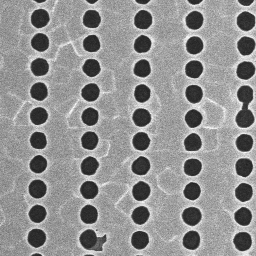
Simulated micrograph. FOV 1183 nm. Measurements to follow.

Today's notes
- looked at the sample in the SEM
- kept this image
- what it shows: a regular array of holes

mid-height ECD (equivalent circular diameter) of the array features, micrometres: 0.0834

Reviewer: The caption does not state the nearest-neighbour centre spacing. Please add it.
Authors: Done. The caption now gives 112 nanometres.